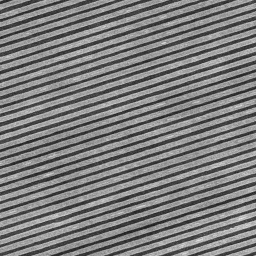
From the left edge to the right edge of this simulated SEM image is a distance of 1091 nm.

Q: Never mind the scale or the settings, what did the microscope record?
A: parallel lines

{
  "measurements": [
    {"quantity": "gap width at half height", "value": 15.7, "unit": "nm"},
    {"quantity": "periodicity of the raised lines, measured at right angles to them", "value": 35.3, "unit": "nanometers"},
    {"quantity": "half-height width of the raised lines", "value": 19.8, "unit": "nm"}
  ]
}